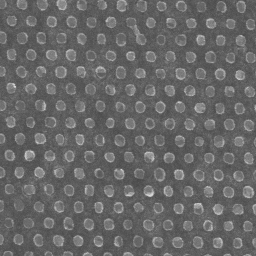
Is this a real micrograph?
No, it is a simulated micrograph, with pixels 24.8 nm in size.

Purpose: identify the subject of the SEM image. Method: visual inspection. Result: a regular array of raised bodies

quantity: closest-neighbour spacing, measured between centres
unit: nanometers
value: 474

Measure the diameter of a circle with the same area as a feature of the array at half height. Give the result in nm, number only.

242